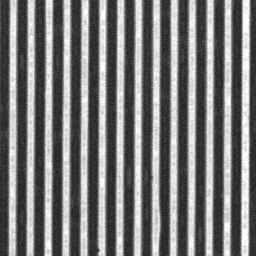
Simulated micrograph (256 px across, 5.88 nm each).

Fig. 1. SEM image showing parallel lines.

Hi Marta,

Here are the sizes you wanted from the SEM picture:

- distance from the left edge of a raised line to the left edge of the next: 105 nanometres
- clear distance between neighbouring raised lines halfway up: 0.0632 um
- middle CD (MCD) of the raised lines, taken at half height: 7.13 px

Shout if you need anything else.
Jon